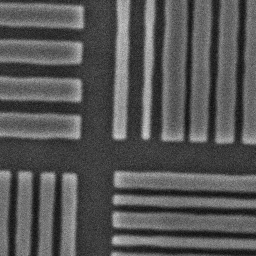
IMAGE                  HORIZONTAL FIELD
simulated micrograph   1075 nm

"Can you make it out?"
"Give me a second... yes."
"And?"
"groups of lines, slits or small figures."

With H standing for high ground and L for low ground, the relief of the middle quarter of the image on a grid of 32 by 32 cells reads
LLLLLLLLLLLLLHHHLLLLHHLLLHHHHHLL
LLLLLLLLLLLLLHHHLLLLHHLLLHHHHHLL
LLLLLLLLLLLLLHHHLLLLHHLLLHHHHHLL
LLLLLLLLLLLLLHHHLLLLHHLLLHHHHHLL
HHHHLLLLLLLLLHHHLLLLHHLLLHHHHHLL
HHHHLLLLLLLLLHHHLLLLHHLLLHHHHHLL
HHHHLLLLLLLLLHHHLLLLHHLLLHHHHHLL
HHHHLLLLLLLLLHHHLLLLHHLLLHHHHHLL
HHHHLLLLLLLLLHHHLLLLHHLLLHHHHHLL
LLLLLLLLLLLLLHHLLLLLHHLLLHHHHHLL
LLLLLLLLLLLLLHHLLLLLHLLLLHHHHHLL
LLLLLLLLLLLLLHHLLLLLHLLLLHHHHHLL
LLLLLLLLLLLLLHHLLLLLHLLLLHHHHHLL
HHHHLLLLLLLLLHHLLLLLHLLLLHHHHHLL
HHHHLLLLLLLLLHHLLLLLHLLLLHHHHHLL
HHHHLLLLLLLLLHHLLLLLHLLLLHHHHHLL
HHHHLLLLLLLLLHHLLLLLHLLLLHHHHHLL
HHHHLLLLLLLLLHHLLLLLHLLLLHHHHHLL
LLLLLLLLLLLLLLLLLLLLHLLLLHHHHHLL
LLLLLLLLLLLLLLLLLLLLLLLLLLLLLLLL
LLLLLLLLLLLLLLLLLLLLLLLLLLLLLLLL
LLLLLLLLLLLLLLLLLLLLLLLLLLLLLLLL
LLLLLLLLLLLLLLLLLLLLLLLLLLLLLLLL
LLLLLLLLLLLLLLLLLLLLLLLLLLLLLLLL
LLLLLLLLLLLLLLLLLLLLLLLLLLLLLLLL
LLLLLLLLLLLLLLLLLLLLLLLLLLLLLLLL
LLLLLLLLLLLLLLLLLLLLLLLLLLLLLLLL
LLLLLLLLLLLLLHHHHHHHHHHHHHHHLLLL
HHHLLLLLLLLLLHHHHHHHHHHHHHHHHHHH
HHHLLLLLLLLLLHHHHHHHHHHHHHHHHHHH
HHHLLLLLLLLLLHHHHHHHHHHHHHHHHHHH
HHHLLLLLLLLLLLLLLLLLLLLLLLLLLLLL